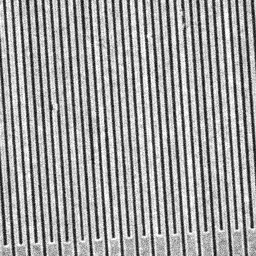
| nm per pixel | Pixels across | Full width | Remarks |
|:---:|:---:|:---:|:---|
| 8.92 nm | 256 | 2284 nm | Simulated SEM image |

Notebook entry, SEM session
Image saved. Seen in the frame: parallel lines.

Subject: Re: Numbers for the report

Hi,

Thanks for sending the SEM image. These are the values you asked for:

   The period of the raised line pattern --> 69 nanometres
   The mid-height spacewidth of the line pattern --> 0.0389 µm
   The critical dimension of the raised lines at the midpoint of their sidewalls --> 31.1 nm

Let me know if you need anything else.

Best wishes